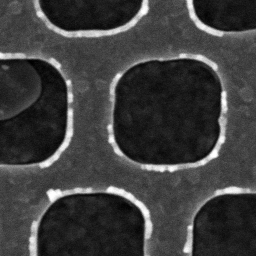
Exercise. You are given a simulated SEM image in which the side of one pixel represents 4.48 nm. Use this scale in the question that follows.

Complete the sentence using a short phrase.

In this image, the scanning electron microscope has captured holes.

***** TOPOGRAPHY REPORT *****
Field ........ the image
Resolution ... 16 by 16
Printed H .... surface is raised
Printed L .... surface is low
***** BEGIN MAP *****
HHHLLLLLLHHHLLLL
HHHLLLLLHHHHHLLL
HHHHHHHHHHHHHHHH
HHHHHHHHHHHHHHHH
LLLLHHHHLLLLLHHH
LLLLHHHLLLLLLLHH
LLLLHHHLLLLLLLHH
LLLLHHHLLLLLLLHH
LLLLHHHLLLLLLLHH
LLLHHHHHLLLLLHHH
HHHHHHHHHHHHHHHH
HHHHHHHHHHHHHHHH
HHHHLLLLHHHHHLLL
HHHLLLLLLHHHLLLL
HHLLLLLLLHHHLLLL
HHLLLLLLLHHHLLLL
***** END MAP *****